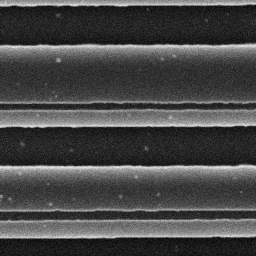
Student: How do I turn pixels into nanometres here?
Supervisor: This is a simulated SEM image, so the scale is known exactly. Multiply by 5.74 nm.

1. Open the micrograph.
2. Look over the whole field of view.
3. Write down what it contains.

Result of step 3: lines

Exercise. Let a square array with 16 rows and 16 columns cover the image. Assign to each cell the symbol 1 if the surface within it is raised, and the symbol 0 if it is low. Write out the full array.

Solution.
0000000000000000
0000000000000000
0000000000000000
1111111111111111
1111111111111111
1111111111111111
1111111111111111
1111111111111111
0000000000000000
0000000000000000
1111111111111111
1111111111111111
1111111111111111
1111111111111111
1111111111111111
0000000000000000